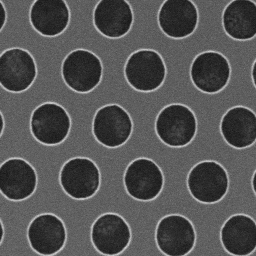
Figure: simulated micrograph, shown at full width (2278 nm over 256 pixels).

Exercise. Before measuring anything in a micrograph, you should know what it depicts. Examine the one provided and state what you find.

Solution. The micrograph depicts a regular array of holes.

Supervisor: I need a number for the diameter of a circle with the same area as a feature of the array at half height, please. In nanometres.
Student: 355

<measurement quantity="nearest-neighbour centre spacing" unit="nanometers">563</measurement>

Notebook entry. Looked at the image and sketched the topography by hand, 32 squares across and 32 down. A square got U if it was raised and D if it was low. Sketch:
UUUUDDDDUUUUDDDDUUUUDDDDUUUUUDDD
DUUUDDDDDUUUDDDDUUUUDDDDDUUUDDDD
DUUUDDDDDUUUDDDDDUUUDDDDDUUUDDDD
UUUUDDDDUUUUDDDDUUUUDDDDUUUUDDDD
UUUUUUUUUUUUUDDUUUUUUDDUUUUUUDDD
UUUUUUUUUUUUUUUUUUUUUUUUUUUUUUUU
UDDUUUUUUDDUUUUUUDDUUUUUUUDUUUUU
DDDDUUUUDDDDUUUUDDDDUUUUDDDDUUUU
DDDDUUUUDDDDDUUUDDDDDUUUDDDDDUUU
DDDDUUUUDDDDDUUUDDDDDUUUDDDDDUUU
DDDDUUUUDDDDUUUUDDDDUUUUDDDDUUUU
UUUUUUUUUUUUUUUUUUUUUUUUUUDUUUUU
UUUUUUUUUUUUUUUUUUUUUUUUUUUUUUUU
UUUUUDDDUUUUUDDUUUUUUDDUUUUUUDDU
UUUUDDDDUUUUDDDDUUUUDDDDUUUUDDDD
UUUUDDDDDUUUDDDDUUUUDDDDDUUUDDDD
UUUUDDDDUUUUDDDDUUUUDDDDUUUUDDDD
UUUUUDDDUUUUDDDDUUUUDDDDUUUUDDDD
UUUUUUUUUUUUUUUUUUUUUUUUUUUUUUUU
UUUUUUUUUUUUUUUUUUUUUUUUUUUUUUUU
DDDDUUUUDDDDUUUUDDDUUUUUUDDUUUUU
DDDDUUUUDDDDUUUUDDDDUUUUDDDDUUUU
DDDDDUUUDDDDUUUUDDDDUUUDDDDDUUUU
DDDDUUUUDDDDUUUUDDDDUUUUDDDDUUUU
UDDDUUUUUDDUUUUUUDDDUUUUDDDDUUUU
UUUUUUUUUUUUUUUUUUUUUUUUUUUUUUUU
UUUUUUUUUUUUUUUUUUUUUUUUUUUUUUUU
UUUUDDDUUUUUDDDUUUUUDDDUUUUUUDDD
UUUUDDDDUUUUDDDDUUUUDDDDUUUUDDDD
UUUUDDDDUUUDDDDDUUUUDDDDUUUUDDDD
UUUUDDDDUUUUDDDDUUUUDDDDUUUUDDDD
UUUUUDDUUUUUUDDUUUUUDDDUUUUUUDDU